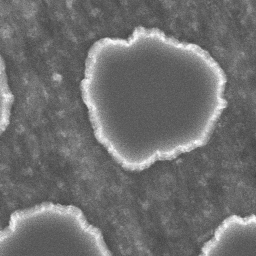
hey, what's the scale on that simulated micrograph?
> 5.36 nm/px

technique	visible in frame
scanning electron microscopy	raised bodies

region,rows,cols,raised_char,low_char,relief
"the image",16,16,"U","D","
DDDDDDDDDDDDDDDD
DDDDDDDDDDDDDDDD
DDDDDDDDUUUDDDDD
DDDDDDUUUUUUUDDD
DDDDDUUUUUUUUUDD
DDDDDUUUUUUUUUDD
DDDDDDUUUUUUUUDD
DDDDDDUUUUUUUDDD
DDDDDDUUUUUUUDDD
DDDDDDDUUUUDDDDD
DDDDDDDDDDDDDDDD
DDDDDDDDDDDDDDDD
DDDDDDDDDDDDDDDD
DUUUUDDDDDDDDDDD
UUUUUUDDDDDDDDUU
UUUUUUUDDDDDDUUU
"